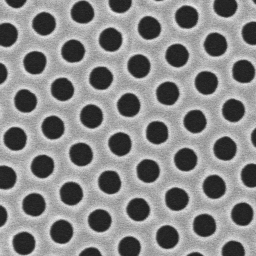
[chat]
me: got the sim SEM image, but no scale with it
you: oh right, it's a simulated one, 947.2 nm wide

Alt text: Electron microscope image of a regular array of holes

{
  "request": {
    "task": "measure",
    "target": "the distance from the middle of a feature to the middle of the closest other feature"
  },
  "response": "0.144 um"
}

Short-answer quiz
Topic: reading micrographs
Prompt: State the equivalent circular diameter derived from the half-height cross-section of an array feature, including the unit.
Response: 23.5 px